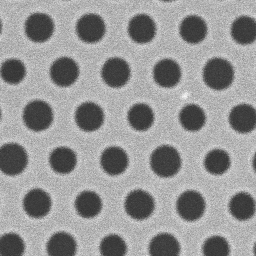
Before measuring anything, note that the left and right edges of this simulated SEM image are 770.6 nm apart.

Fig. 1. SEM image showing a regular array of holes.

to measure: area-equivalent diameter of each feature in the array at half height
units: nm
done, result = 91.6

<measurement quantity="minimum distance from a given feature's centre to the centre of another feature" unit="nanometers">152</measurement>